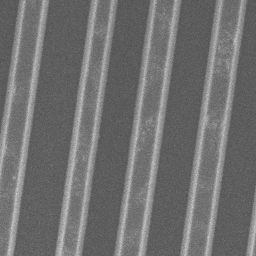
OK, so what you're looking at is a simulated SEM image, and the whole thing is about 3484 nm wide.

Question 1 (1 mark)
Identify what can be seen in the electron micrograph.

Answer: one or a few lines or trenches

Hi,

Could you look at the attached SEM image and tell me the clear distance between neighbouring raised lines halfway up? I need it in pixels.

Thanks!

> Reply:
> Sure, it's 40.3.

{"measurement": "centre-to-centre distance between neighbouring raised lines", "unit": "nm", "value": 875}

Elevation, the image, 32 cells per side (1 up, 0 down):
00011100000011000001110000011100
00011100000011000001110000011100
00111000000111000001110000011100
00111000000111000001110000011100
00111000000111000011110000011100
00111000000111000011110000011100
00111000000110000011100000111100
00111000000110000011100000111000
00111000000110000011100000111000
01110000001110000011100000111000
01110000001110000011100000111000
01110000001110000111100000111000
01110000001110000111100000111000
01110000001100000111000000111000
01110000001100000111000001110000
01110000001100000111000001110000
11100000011100000111000001110000
11100000011100000111000001110000
11100000011100001111000001110000
11100000011100001111000001110000
11100000011000001110000001110000
11100000011000001110000011100000
11100000011000001110000011100000
11000000111000001110000011100000
11000000111000001110000011100000
11000000111000011110000011100000
11000000111000011110000011100000
11000000110000011100000011100000
11000000110000011100000111000000
11000000110000011100000111000001
10000001110000011100000111000001
10000001110000011100000111000001